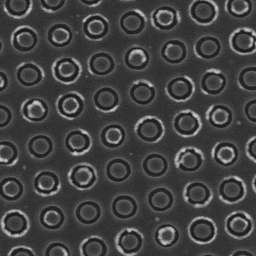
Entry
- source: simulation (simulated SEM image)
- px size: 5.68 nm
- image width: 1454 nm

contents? a regular array of ring-shaped grooves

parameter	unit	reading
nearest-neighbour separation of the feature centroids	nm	199